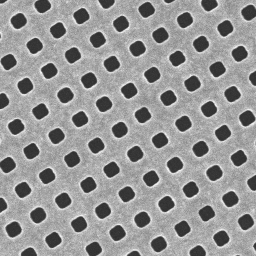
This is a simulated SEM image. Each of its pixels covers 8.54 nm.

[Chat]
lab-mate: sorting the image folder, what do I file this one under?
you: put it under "a regular array of holes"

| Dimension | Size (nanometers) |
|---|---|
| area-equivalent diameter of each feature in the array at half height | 133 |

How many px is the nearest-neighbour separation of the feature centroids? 27.9